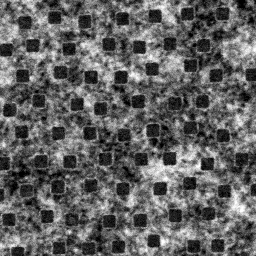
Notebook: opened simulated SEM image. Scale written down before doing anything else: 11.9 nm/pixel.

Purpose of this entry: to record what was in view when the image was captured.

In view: a regular array of raised bodies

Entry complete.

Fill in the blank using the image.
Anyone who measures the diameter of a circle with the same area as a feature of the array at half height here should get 188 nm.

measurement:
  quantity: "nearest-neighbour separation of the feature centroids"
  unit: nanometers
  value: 335